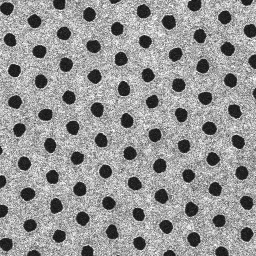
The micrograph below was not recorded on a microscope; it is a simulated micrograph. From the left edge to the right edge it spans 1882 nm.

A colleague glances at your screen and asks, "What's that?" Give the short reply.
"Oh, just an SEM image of a regular array of holes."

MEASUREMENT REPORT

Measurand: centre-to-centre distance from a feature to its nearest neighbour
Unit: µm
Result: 0.218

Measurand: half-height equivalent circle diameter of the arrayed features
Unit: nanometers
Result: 98.8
